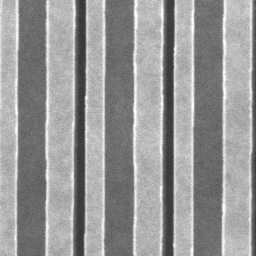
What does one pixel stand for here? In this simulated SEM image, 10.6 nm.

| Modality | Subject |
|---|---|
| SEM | lines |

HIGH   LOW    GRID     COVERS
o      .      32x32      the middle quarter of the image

ooo...oooo........ooooooo...oooo
oo...ooooo........ooooooo...oooo
ooo..ooooo........ooooooo...oooo
ooo...oooo........ooooooo...oooo
ooo...oooo........ooooooo...oooo
ooo...oooo........ooooooo...oooo
ooo...oooo........ooooooo...oooo
ooo...oooo........ooooooo...oooo
oo...ooooo........ooooooo...oooo
oo...ooooo........ooooooo...oooo
ooo..ooooo........ooooooo...oooo
ooo..ooooo........ooooooo...oooo
ooo..ooooo........ooooooo...oooo
oo...ooooo........ooooooo...oooo
oo...ooooo........ooooooo...oooo
oo...ooooo........ooooooo...oooo
oo...ooooo........ooooooo...oooo
oo...ooooo........ooooooo...oooo
oo...ooooo........oooooo....oooo
oo...ooooo........oooooo....oooo
oo...ooooo........oooooo....oooo
oo...ooooo........oooooo....oooo
oo...ooooo........oooooo....oooo
oo...ooooo........ooooooo...oooo
oo...ooooo........oooooo....oooo
oo...ooooo........oooooo....oooo
oo...ooooo........oooooo....oooo
oo...ooooo........oooooo....oooo
oo...ooooo........oooooo....oooo
oo...ooooo........oooooo....oooo
oo...ooooo........oooooo....oooo
oo...ooooo........oooooo....oooo